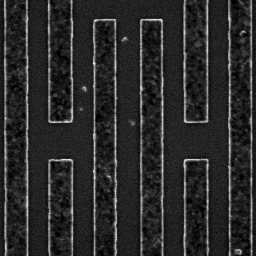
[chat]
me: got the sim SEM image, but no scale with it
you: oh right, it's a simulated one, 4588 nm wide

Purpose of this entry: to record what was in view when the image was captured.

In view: wiring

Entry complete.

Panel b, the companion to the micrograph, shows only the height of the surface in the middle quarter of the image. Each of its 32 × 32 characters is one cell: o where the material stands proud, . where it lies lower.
oo......ooooo......ooooo......oo
oo......ooooo......ooooo......oo
oo......ooooo......ooooo......oo
oo......ooooo......oooooo.....oo
oo......ooooo......oooooo.....oo
oo......ooooo......oooooo.....oo
oo......ooooo......ooooo......oo
oo......ooooo......ooooo......oo
oo......ooooo......oooooo.....oo
oo......ooooo......oooooo.....oo
oo......ooooo......oooooo.....oo
oo......ooooo......oooooo.....oo
oo......ooooo......oooooo.....oo
oo......ooooo......oooooo.....oo
........ooooo......oooooo.......
........ooooo......oooooo.......
........ooooo......oooooo.......
........ooooo......oooooo.......
........ooooo......oooooo.......
........ooooo......oooooo.......
........ooooo......oooooo.......
........ooooo......oooooo.......
........ooooo......oooooo.......
........ooooo......oooooo.......
oo......ooooo......oooooo.....oo
oo......ooooo......oooooo.....oo
oo......ooooo......oooooo.....oo
oo......ooooo......oooooo.....oo
oo......ooooo......oooooo.....oo
oo......ooooo......oooooo.....oo
oo......ooooo......oooooo.....oo
oo......ooooo......oooooo.....oo